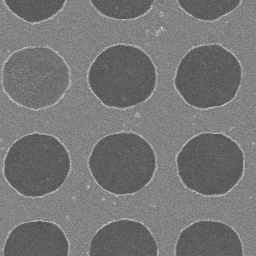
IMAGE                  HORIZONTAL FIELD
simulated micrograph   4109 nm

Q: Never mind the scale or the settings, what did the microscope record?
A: holes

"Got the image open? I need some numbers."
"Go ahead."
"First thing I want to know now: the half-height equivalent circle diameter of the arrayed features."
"1020 nanometres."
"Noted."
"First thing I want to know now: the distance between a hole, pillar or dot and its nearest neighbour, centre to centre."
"1.38 micrometres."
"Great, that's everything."